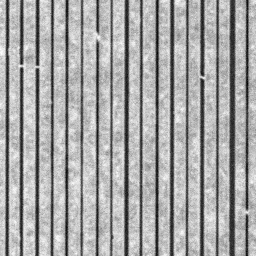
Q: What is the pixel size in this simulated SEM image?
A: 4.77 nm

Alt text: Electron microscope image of parallel lines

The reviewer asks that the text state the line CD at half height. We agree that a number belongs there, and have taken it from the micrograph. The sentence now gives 51.3 nanometres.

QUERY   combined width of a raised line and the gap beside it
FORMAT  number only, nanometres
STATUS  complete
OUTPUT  71.8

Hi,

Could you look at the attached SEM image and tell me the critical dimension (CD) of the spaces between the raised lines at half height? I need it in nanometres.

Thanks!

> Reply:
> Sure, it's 17.3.